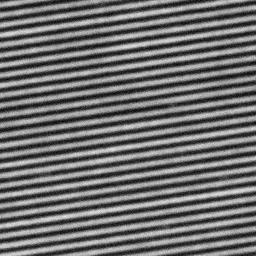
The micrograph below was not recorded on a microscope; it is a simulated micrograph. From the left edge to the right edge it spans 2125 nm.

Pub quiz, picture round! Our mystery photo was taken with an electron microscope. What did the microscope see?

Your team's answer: parallel lines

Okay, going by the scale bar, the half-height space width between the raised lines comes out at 55.5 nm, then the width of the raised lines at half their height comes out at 31.8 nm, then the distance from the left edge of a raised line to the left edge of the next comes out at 82.5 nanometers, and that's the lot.